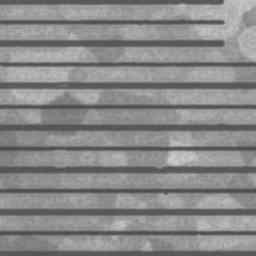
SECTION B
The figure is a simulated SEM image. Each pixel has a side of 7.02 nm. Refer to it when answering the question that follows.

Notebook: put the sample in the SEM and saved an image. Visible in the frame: parallel lines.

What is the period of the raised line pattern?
147 nm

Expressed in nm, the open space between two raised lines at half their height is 38.6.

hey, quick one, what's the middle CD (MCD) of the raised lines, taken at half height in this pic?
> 103 nanometers